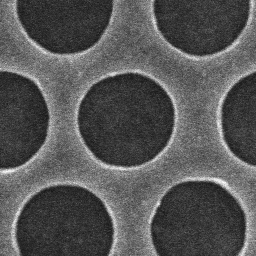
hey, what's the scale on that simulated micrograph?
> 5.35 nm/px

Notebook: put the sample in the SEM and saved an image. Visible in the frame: holes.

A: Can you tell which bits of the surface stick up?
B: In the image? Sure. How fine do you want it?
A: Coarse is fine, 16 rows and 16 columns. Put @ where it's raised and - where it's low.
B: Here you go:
@------@@@------
@------@@@-----@
@@----@@@@-----@
@@@@@@@@@@@@-@@@
-@@@@@@@@@@@@@@@
--@@@@----@@@@--
---@@------@@@--
---@@------@@@--
---@@------@@@--
--@@@@----@@@@--
-@@@@@@@@@@@@@@@
@@@@@@@@@@@---@@
@@----@@@@-----@
@------@@@-----@
@------@@------@
@------@@@-----@